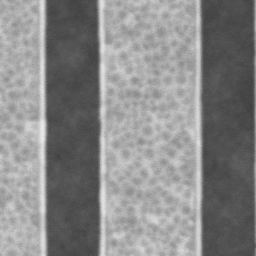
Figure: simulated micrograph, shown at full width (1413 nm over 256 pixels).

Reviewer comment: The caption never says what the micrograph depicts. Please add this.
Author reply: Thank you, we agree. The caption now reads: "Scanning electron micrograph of one or a few lines or trenches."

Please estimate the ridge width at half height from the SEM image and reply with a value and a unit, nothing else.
530 nanometres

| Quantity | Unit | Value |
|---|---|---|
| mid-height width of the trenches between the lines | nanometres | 333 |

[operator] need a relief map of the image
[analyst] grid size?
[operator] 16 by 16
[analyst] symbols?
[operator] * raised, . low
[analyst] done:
***...******....
***...******....
***...******....
***...******....
***...******....
***...******....
***...******....
***...******....
***...******....
***...******....
***...******....
***...******....
***...******....
***...******....
***...******....
***...******....